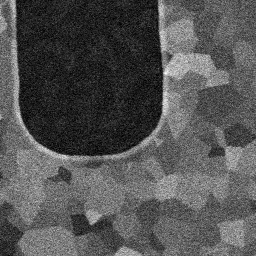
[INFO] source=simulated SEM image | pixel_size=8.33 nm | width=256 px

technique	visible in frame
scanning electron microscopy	one or a few lines or trenches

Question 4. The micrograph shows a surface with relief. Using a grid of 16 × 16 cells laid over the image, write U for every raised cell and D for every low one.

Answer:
UDDDDDDDDDUUUUUU
UDDDDDDDDDUUUUUU
UDDDDDDDDDUUUUUU
UDDDDDDDDDUUUUUU
UDDDDDDDDDUUUUUU
UDDDDDDDDDUUUUUU
UDDDDDDDDDUUUUUU
UDDDDDDDDDUUUUUU
UUDDDDDDDUUUUUUU
UUUDDDDDUUUUUUUU
UUUUUUUUUUUUUUUU
UUUUUUUUUUUUUUUU
UUUUUUUUUUUUUUUU
UUUUUUUUUUUUUUUU
UUUUUUUUUUUUUUUU
UUUUUUUUUUUUUUUU